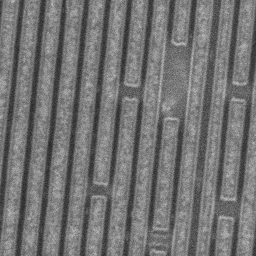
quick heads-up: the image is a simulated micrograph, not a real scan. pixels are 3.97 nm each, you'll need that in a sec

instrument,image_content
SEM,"parallel lines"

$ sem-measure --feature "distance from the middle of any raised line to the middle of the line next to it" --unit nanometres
85.3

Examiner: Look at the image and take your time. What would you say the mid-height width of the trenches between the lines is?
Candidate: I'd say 0.0272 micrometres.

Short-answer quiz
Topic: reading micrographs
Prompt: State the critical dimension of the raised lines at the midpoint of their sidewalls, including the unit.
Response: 57.8 nm